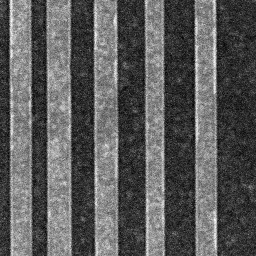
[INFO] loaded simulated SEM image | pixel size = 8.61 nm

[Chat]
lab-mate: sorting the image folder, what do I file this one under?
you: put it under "parallel lines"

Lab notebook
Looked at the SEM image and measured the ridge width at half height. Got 172 nm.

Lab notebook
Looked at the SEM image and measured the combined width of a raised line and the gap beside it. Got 398 nanometres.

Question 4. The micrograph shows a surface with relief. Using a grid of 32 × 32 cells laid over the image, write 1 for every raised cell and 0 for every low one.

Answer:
01110011100011100011000001100000
01110011100011100011000001100000
01110011100011100011000001100000
01110011100011100011000001100000
01110011100011100011000001100000
01110011100011100011000001100000
01110011100011100011000001100000
01110011100011100011000001100000
01110011100011100011000001100000
01110011100011100011000001100000
01110011100011100011000001100000
01110011100011100011000001100000
01110011100011100011000001100000
01110011100011100011000001100000
01110011100011100011000001100000
01110011100011100011000001100000
01110011100011100011000001100000
01110011100011100011000001100000
01110011100011100011000001100000
01110011100011100011000001100000
01110011100011100011000001100000
01110011100011100011000001100000
01110011100011100011000001100000
00110011100011100011000001100000
00110011100011100011000001100000
01110011100011100011000001100000
00110011100011100011000001100000
00110011100011100011000001100000
00110011100011100011000001100000
00110011100011100011000001100000
00110011100011100011000001100000
00110011100011100011000001100000